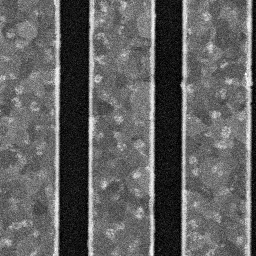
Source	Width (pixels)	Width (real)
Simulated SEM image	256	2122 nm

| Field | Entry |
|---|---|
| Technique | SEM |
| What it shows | one or a few lines or trenches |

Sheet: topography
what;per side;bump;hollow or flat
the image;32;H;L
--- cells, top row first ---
HHHHHHHLLLLHHHHHHHHLLLLHHHHHHHHL
HHHHHHHLLLLHHHHHHHHLLLLHHHHHHHHL
HHHHHHHLLLLHHHHHHHHLLLLHHHHHHHHL
HHHHHHHLLLLHHHHHHHHLLLLHHHHHHHHL
HHHHHHHLLLLHHHHHHHHLLLLHHHHHHHHL
HHHHHHHLLLLHHHHHHHHLLLLHHHHHHHHL
HHHHHHHLLLLHHHHHHHHLLLLHHHHHHHHL
HHHHHHHLLLLHHHHHHHHLLLLHHHHHHHHL
HHHHHHHLLLLHHHHHHHHLLLLHHHHHHHHL
HHHHHHHLLLLHHHHHHHHLLLLHHHHHHHHL
HHHHHHHLLLLHHHHHHHHLLLLHHHHHHHHL
HHHHHHHLLLLHHHHHHHHLLLLHHHHHHHHL
HHHHHHHLLLLHHHHHHHHLLLLHHHHHHHHL
HHHHHHHLLLLHHHHHHHHLLLLHHHHHHHHL
HHHHHHHLLLLHHHHHHHHLLLLHHHHHHHHL
HHHHHHHLLLLHHHHHHHHLLLLHHHHHHHHL
HHHHHHHLLLLHHHHHHHHLLLLHHHHHHHHL
HHHHHHHLLLLHHHHHHHHLLLLHHHHHHHHL
HHHHHHHLLLLHHHHHHHHLLLLHHHHHHHHL
HHHHHHHLLLLHHHHHHHHLLLLHHHHHHHHL
HHHHHHHLLLLHHHHHHHHLLLLHHHHHHHHL
HHHHHHHLLLLHHHHHHHHLLLLHHHHHHHHL
HHHHHHHLLLLHHHHHHHHLLLLHHHHHHHHL
HHHHHHHLLLLHHHHHHHHLLLLHHHHHHHHL
HHHHHHHLLLLHHHHHHHHLLLLHHHHHHHHL
HHHHHHHLLLLHHHHHHHHLLLLHHHHHHHHL
HHHHHHHLLLLHHHHHHHHLLLLHHHHHHHHL
HHHHHHHLLLLHHHHHHHHLLLLHHHHHHHHL
HHHHHHHLLLLHHHHHHHHLLLLHHHHHHHHL
HHHHHHHLLLLHHHHHHHHLLLLHHHHHHHHL
HHHHHHHLLLLHHHHHHHHLLLLHHHHHHHHL
HHHHHHHLLLLHHHHHHHHLLLLHHHHHHHHL